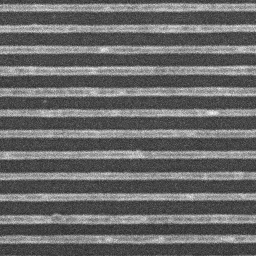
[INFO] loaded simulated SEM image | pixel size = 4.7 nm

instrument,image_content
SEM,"parallel lines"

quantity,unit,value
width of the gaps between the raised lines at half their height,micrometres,0.07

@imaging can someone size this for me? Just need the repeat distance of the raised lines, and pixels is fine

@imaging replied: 21.1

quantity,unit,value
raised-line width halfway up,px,6.51